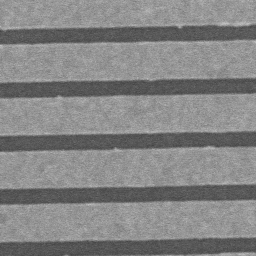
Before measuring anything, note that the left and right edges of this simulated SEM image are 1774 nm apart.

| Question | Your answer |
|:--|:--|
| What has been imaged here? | parallel lines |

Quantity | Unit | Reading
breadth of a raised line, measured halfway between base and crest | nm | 256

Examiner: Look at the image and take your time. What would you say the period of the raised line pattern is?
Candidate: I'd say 369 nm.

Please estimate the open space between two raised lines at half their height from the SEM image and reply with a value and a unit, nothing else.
114 nm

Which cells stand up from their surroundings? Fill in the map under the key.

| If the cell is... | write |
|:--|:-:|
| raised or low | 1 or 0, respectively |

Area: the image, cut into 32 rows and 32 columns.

11111111111111111111111111111111
11111111111111111111111111111111
11111111111111111111111111111111
10000000000000000000000000000000
00000000000000000000000000000000
00000000011111111111111111111111
11111111111111111111111111111111
11111111111111111111111111111111
11111111111111111111111111111111
11111111111111111111111111111111
00000000000000000000000000000000
00000000000000000000000000000000
11111111111111111111111111111111
11111111111111111111111111111111
11111111111111111111111111111111
11111111111111111111111111111111
11111111111111111110111100000000
00000000000000000000000000000000
00000000000000000000000101111000
11111111111111111111111111111111
11111111111111111111111111111111
11111111111111111111111111111111
11111111111111111111111111111111
01100000000000000000000000000000
00000000000000000000000000000000
00000000100011111111111111111111
11111111111111111111111111111111
11111111111111111111111111111111
11111111111111111111111111111111
11111111111111111111111111111111
00000000000000000000000000000000
00000000000000000000000000000000